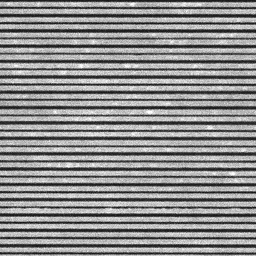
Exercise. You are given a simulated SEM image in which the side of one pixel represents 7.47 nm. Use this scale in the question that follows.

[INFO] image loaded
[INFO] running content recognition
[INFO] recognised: parallel lines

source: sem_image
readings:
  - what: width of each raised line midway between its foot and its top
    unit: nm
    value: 36.4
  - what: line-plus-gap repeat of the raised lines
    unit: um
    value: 0.0573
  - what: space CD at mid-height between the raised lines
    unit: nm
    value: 21.5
